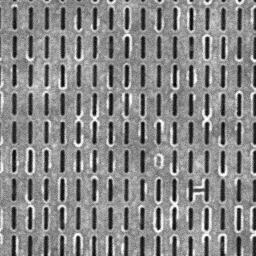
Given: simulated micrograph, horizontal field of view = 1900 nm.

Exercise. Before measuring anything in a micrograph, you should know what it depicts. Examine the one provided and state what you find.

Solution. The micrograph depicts a regular array of holes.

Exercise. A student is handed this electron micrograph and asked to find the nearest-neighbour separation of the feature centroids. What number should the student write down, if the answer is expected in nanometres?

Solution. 116